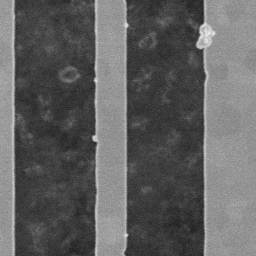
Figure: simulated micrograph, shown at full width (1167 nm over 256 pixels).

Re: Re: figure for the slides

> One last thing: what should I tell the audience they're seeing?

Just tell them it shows one or a few lines or trenches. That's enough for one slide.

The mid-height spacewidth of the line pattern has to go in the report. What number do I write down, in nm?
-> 362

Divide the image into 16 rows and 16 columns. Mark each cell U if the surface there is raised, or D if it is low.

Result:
UDDDDDUUDDDDDUUU
UDDDDDUUDDDDDUUU
UDDDDDUUDDDDUUUU
UDDDDDUUDDDDDUUU
UDDDDDUUDDDDDUUU
UDDDDDUUDDDDDUUU
UDDDDDUUDDDDDUUU
UDDDDDUUDDDDDUUU
UDDDDDUUDDDDDUUU
UDDDDDUUDDDDDUUU
UDDDDDUUDDDDDUUU
UDDDDDUUDDDDDUUU
UDDDDDUUDDDDDUUU
UDDDDDUUDDDDDUUU
UDDDDDUUDDDDDUUU
UDDDDDUUDDDDDUUU